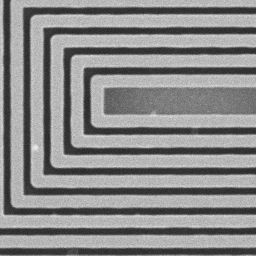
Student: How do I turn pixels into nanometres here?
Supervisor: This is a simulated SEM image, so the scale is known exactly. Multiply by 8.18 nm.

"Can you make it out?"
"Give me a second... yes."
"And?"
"groups of lines, slits or small figures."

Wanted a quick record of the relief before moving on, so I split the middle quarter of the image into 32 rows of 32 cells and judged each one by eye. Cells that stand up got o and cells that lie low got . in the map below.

..oooooooooooooooooooooooooooooo
..ooo...........................
..ooo...........................
..ooo..ooooooooooooooooooooooooo
..ooo..ooooooooooooooooooooooooo
..ooo..ooooooooooooooooooooooooo
..ooo..ooo......................
..ooo..ooo......................
..ooo..ooo......................
..ooo..ooo......................
..ooo..ooo......................
..ooo..ooo......................
..ooo..ooo......................
..ooo..ooooooooooooooooooooooooo
..ooo..ooooooooooooooooooooooooo
..ooo..ooooooooooooooooooooooooo
..ooo...........................
..ooo...........................
..oooooooooooooooooooooooooooooo
..oooooooooooooooooooooooooooooo
..oooooooooooooooooooooooooooooo
................................
................................
oooooooooooooooooooooooooooooooo
oooooooooooooooooooooooooooooooo
oooooooooooooooooooooooooooooooo
................................
................................
oooooooooooooooooooooooooooooooo
oooooooooooooooooooooooooooooooo
oooooooooooooooooooooooooooooooo
................................